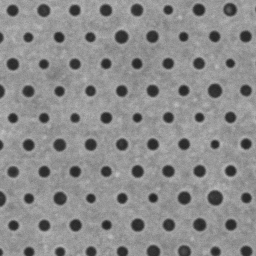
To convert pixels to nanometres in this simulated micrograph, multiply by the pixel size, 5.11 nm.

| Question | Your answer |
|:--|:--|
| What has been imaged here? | a regular array of holes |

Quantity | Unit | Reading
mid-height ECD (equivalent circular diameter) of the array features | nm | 62.4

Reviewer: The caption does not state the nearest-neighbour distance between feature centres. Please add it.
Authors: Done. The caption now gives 157 nanometres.